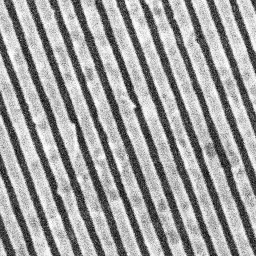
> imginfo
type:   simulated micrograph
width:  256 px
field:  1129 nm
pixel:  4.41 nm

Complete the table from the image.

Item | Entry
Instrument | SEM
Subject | parallel lines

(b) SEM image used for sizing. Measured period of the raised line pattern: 93.1 nm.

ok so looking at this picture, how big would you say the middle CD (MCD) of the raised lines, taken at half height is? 56.5 nm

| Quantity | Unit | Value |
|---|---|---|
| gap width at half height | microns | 0.0394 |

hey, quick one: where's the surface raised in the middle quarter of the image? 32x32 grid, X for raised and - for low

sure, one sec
XX--XXX---XXX--XXXX--XXX---XXX--
XX---XXX--XXXX--XXX---XXX--XXXX-
XXX--XXX---XXX--XXXX--XXX---XXX-
XXX--XXXX--XXX---XXX--XXX---XXX-
XXX---XXX--XXXX--XXX---XXX--XXXX
-XXX--XXX---XXX--XXXX--XXX---XXX
-XXX--XXXX--XXX---XXX--XXXX--XXX
-XXX---XXX--XXXX--XXX---XXX--XXX
--XXX--XXX---XXX---XXX--XXXX--XX
--XXX---XXX--XXXX--XXX---XXX--XX
--XXXX--XXX---XXX--XXX---XXX--XX
---XXX--XXXX--XXX---XXX--XXX---X
X--XXX---XXX--XXXX--XXX---XXX--X
X---XXX--XXX---XXX--XXXX--XXX---
XX--XXX--XXXX--XXX---XXX--XXX---
XX--XXX---XXX--XXXX--XXX---XXX--
XXX--XXX--XXX---XXX---XXX--XXX--
XXX--XXX---XXX--XXXX--XXX--XXXX-
XXX--XXXX--XXX--XXXX--XXX---XXX-
XXX---XXX--XXXX--XXXX--XXX--XXX-
XXXX--XXX--XXXX--XXXX--XXX--XXXX
-XXX--XXXX--XXX---XXX--XXXX--XXX
-XXX---XXX--XXXX--XXX---XXX--XXX
--XXX--XXX---XXX---XXX--XXX---XX
--XXX--XXXX--XXX---XXX--XXXX--XX
--XXXX--XXX--XXXX--XXX---XXX--XX
--XXXX--XXX---XXX--XXXX--XXX---X
X--XXX---XXX--XXX---XXX---XX---X
X--XXXX--XXX--XXXX--XXXX--XXX---
X---XXX--XXXX--XXX---XXX--XXX---
XX--XXX---XXX--XXX---XXX---XXX--
XX---XXX--XXX--XXXX--XXXX--XXX--